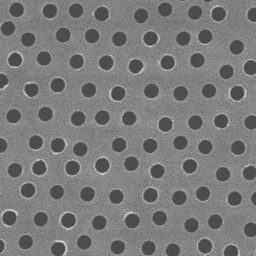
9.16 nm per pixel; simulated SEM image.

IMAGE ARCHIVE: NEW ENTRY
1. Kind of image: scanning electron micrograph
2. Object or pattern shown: a regular array of holes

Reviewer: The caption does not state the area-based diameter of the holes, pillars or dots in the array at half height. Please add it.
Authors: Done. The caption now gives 0.131 µm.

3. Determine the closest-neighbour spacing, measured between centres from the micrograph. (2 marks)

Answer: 227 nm